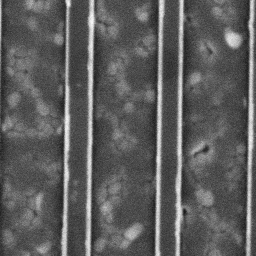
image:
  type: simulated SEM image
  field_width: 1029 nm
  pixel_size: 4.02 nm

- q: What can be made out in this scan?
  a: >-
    one or a few lines or trenches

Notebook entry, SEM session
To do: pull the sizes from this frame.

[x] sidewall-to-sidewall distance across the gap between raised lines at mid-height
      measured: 269 nm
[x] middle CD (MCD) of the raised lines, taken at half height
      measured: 101 nanometers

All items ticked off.